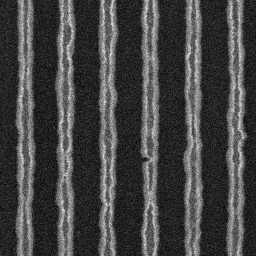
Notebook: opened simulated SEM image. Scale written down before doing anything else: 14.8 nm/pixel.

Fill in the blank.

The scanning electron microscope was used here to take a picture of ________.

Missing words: parallel lines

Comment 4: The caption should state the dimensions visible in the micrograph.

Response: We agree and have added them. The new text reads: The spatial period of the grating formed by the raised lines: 624 nanometres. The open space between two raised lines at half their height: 467 nm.